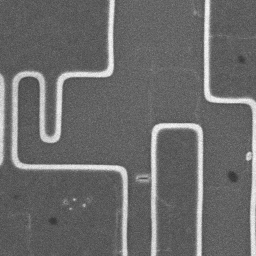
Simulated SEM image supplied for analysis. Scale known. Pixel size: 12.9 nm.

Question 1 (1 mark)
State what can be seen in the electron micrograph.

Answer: wiring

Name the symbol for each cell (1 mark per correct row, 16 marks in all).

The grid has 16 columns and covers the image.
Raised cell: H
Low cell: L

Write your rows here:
HHHHHHHLLLLLLHHH
HHHHHHHLLLLLLHHH
HHHHHHHLLLLLLHHH
HHHHHHHLLLLLLHHH
HHHHHHHLLLLLLHHH
HLLHLLLLLLLLLHHH
HLLHLLLLLLLLLLLL
HLLHLLLLLLLLLLLL
HLLLLLLLLLHHHLLL
HLLLLLLLLLHHHLLL
HHHHHHHLLLHHLLLL
HHHHHHHHLLHHLLLL
HHHHHHHHLLHHLLLL
HHHHHHHHLLHHLLLL
HHHHHHHHLLHHLLLL
HHHHHHHHLLHHLLLL